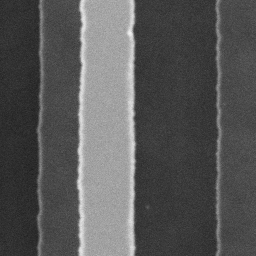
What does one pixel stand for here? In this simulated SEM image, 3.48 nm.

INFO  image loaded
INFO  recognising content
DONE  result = lines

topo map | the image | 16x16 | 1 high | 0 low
0011111100000011
0001111100000011
0001111100000011
0001111100000011
0001111100000011
0001111100000011
0001111100000011
0011111100000011
0011111100000011
0011111100000011
0011111100000011
0011111100000011
0011111100000011
0011111100000011
0011111100000011
0011111100000011